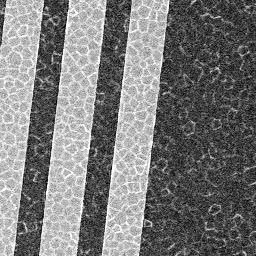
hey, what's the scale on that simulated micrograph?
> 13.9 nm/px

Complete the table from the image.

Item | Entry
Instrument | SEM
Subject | one or a few lines or trenches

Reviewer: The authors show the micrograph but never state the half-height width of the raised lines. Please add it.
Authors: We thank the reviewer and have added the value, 0.471 microns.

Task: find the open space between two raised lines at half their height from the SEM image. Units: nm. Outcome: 358